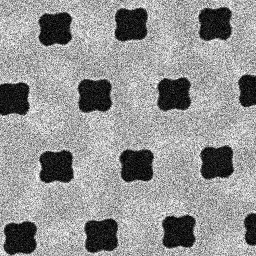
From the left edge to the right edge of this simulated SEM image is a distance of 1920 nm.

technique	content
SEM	a regular array of holes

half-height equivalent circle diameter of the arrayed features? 0.264 micrometres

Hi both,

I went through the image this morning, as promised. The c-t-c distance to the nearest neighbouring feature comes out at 0.588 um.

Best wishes